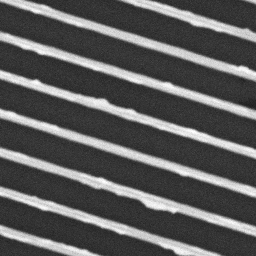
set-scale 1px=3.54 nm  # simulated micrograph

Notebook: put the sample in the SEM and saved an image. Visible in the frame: parallel lines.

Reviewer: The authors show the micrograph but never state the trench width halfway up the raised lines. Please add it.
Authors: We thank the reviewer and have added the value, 0.102 um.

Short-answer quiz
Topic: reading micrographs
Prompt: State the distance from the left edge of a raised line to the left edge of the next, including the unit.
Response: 37 px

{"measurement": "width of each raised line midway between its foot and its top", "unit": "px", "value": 8.47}